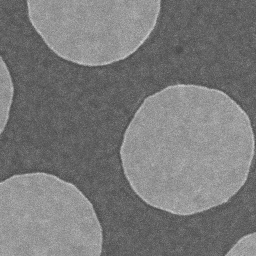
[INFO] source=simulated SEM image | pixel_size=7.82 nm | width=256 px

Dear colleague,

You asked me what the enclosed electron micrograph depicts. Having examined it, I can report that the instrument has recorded raised bodies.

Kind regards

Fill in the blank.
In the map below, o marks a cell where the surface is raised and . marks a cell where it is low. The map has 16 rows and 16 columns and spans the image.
..oooooooo......
..oooooooo......
...oooooo.......
....oooo........
o...............
o.........ooo...
o........oooooo.
........oooooooo
........oooooooo
........oooooooo
........oooooooo
oooo....ooooooo.
ooooo....ooooo..
oooooo..........
oooooo..........
oooooo.........o